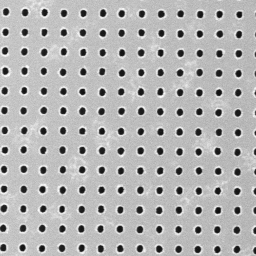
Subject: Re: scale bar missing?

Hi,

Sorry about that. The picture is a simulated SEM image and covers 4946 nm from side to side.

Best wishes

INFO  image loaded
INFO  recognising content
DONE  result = a regular array of holes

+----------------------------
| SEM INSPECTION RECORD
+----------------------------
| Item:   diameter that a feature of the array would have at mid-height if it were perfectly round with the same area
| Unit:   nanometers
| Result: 143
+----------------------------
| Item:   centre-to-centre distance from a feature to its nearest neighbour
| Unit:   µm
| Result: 0.367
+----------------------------